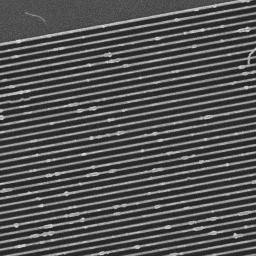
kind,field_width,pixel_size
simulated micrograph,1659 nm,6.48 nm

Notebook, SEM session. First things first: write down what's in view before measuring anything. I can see parallel lines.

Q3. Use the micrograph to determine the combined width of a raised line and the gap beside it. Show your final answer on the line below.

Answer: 46.7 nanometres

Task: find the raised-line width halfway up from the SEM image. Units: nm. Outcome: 16.8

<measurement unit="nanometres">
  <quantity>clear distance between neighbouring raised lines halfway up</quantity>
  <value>34.3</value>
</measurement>